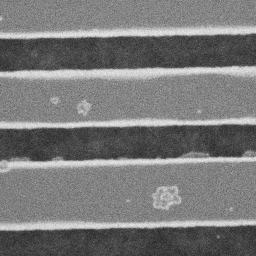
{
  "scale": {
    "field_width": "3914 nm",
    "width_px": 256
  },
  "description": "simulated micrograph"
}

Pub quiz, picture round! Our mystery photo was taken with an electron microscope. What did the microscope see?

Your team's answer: lines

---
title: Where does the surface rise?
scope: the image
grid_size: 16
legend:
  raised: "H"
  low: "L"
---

HHHHHHHHHHHHHHHH
HHHHHHHHHHHHHHHH
LLLLLLLLLLLLLLLL
LLLLLLLLLLLLLLLL
LLLLLHHHHHHHHHHH
HHHHHHHHHHHHHHHH
HHHHHHHHHHHHHHHH
HHHHHHHHHHHHHHHH
LLLLLLLLLLLLLLLL
LLLLLLLLLLLLLLLL
HHHHHHHHHHHHHHHH
HHHHHHHHHHHHHHHH
HHHHHHHHHHHHHHHH
HHHHHHHHHHHHHHHH
LLLLLLLLLLLLLLLL
LLLLLLLLLLLLLLLL